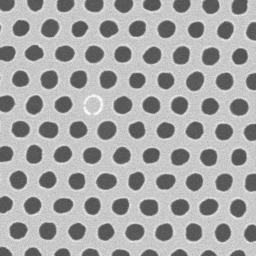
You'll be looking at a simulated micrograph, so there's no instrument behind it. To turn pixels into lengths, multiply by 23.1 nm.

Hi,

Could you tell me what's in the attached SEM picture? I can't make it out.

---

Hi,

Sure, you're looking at a regular array of holes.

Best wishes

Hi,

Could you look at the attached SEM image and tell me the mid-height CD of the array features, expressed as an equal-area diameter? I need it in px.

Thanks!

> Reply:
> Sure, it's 17.9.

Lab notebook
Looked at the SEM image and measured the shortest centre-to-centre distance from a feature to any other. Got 0.661 micrometres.